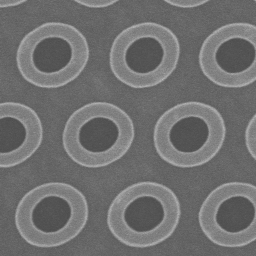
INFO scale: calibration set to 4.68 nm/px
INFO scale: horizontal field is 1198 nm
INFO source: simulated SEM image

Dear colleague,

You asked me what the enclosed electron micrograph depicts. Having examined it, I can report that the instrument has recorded ring-shaped raised bodies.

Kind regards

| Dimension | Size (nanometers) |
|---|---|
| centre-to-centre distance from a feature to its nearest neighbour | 428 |